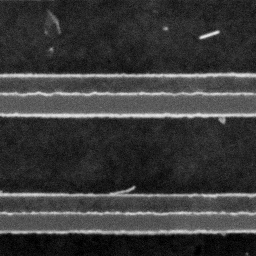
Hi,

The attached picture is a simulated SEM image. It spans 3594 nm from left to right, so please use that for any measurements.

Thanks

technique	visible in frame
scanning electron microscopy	lines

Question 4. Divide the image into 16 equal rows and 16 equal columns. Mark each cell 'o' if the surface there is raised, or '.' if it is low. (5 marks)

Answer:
................
................
................
................
................
oooooooooooooooo
oooooooooooooooo
................
................
................
................
................
oooooooooooooooo
oooooooooooooooo
ooooo.oo.o...o..
................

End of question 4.